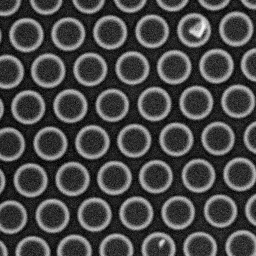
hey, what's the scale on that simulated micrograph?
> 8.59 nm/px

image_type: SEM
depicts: an array of small figures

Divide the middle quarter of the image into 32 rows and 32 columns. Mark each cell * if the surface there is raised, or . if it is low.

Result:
...********..********..*********
...********..********..*********
...*******...********...*******.
...*******....******....*******.
....*****......****.......***...
................................
.**........**.......*****.....**
****.....******....*******....**
*****....*******...*******...***
******..********...********..***
******..********...********..***
******..********...*******...***
*****....******....*******....**
****......*****.....*****......*
.**.............................
.......*........***.......****..
....******.....******....******.
...********...*******...********
...********...********..********
*..********...********..********
*..********...*******...********
...********...*******....******.
....******.....*****......****..
......**........................
............**.......****......*
*****.....*****.....******....**
******...*******...********...**
******...********..********...**
******..*********..********...**
******...********..********...**
******...*******....******....**
*****.....*****.....*****.......